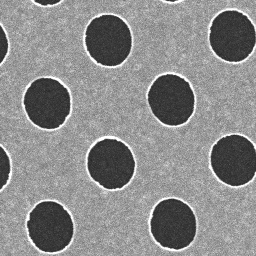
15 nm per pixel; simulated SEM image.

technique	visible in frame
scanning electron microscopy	holes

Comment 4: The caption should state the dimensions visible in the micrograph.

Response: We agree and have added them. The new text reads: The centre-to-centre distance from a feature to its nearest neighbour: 86.6 pixels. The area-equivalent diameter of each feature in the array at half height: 49 px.